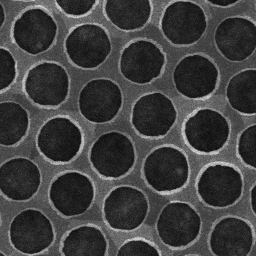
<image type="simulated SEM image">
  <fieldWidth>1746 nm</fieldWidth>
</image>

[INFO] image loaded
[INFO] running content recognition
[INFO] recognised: a regular array of holes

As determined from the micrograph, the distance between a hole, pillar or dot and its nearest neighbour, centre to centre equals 0.377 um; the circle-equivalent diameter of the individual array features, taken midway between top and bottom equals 301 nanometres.